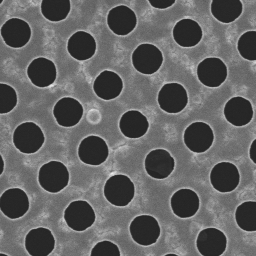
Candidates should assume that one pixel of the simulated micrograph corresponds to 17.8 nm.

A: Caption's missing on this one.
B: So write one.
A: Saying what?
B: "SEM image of a regular array of holes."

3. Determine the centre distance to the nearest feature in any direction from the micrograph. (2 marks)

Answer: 0.833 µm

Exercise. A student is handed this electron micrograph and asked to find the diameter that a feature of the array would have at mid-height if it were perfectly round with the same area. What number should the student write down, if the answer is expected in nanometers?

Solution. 533